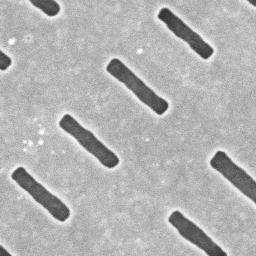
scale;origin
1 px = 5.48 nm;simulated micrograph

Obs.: holes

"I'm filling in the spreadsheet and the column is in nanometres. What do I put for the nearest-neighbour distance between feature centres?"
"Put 392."